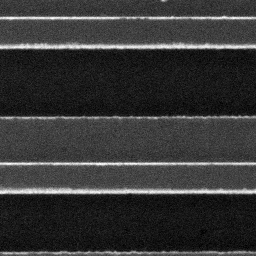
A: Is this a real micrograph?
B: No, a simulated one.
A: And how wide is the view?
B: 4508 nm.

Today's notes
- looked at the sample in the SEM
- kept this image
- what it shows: lines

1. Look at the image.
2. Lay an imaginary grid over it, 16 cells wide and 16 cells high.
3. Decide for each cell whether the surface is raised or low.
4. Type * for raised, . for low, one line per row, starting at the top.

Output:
****************
****************
****************
................
................
................
................
****************
****************
****************
****************
****************
................
................
................
................